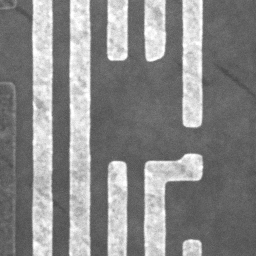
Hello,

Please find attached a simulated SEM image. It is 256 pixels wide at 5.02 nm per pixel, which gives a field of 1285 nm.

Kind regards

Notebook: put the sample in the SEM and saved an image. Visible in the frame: wiring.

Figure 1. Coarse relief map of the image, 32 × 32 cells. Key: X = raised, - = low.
XX--XX---XX---XX--XXX--XX-------
----XX---XX---XX--XXX--XX-------
----XX---XX---XX--XXX--XX-------
----XX---XX--XXX--XXX--XX-------
----XX---XX--XXX--XXX--XX-------
----XX---XX--XXX--XXX--XX-------
----XX---XX--XXX--XXX--XX-------
----XX---XX------------XX-------
----XX---XX------------XX-------
----XX---XX------------XX-------
XX--XX---XX------------XX-------
XX--XX---XX------------XX-------
XX--XX---XX------------XX-------
XX--XX---XX------------XX-------
XX--XX---XX------------XX-------
XX--XX---XX------------XX-------
XX--XX---XX---------------------
XX--XX---XX---------------------
XX--XX---XX---------------------
XX--XX---XX------------XX-------
XX--XX---XX---XX--XXXXXXX-------
XX--XX---XX---XX--XXXXXXX-------
XX--XX---XX---XX--XXXXXXX-------
XX--XX---XX---XX--XXX-----------
XX--XX---XX---XX--XXX-----------
XX--XX---XX---XX--XXX-----------
XX--XX---XX---XX--XXX-----------
XX--XX---XX---XX--XXX-----------
XX--XX---XX---XX--XXX-----------
XX--XX---XX---XX--XXX-----------
XX--XX---XX---XX--XXX--XX-------
XX--XX---XX---XX--XXX--XX-------